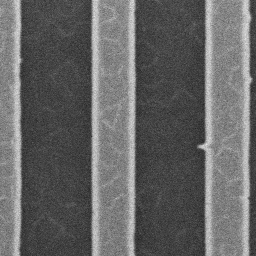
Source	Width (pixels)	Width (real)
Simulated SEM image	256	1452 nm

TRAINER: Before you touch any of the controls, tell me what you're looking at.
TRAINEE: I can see one or a few lines or trenches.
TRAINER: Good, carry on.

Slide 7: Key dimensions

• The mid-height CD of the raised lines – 213 nm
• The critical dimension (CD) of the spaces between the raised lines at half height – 436 nanometres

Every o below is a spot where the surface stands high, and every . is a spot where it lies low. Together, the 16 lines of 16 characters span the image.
o.....oo.....oo.
o.....oo.....oo.
o.....oo.....oo.
o.....oo.....oo.
o.....oo.....oo.
o.....oo.....oo.
o.....oo.....oo.
o.....oo.....oo.
o.....oo.....oo.
o.....oo.....oo.
o.....oo.....oo.
o.....oo.....oo.
o.....oo.....oo.
o.....oo.....oo.
o.....oo.....oo.
o.....oo.....oo.